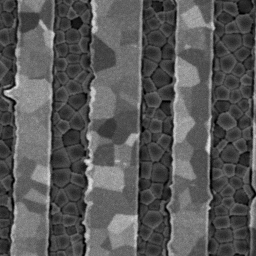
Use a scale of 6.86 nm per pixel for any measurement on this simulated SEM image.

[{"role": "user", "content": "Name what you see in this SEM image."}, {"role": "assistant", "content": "one or a few lines or trenches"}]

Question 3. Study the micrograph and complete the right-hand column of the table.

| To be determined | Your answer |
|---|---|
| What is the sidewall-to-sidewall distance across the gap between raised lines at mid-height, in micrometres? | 0.262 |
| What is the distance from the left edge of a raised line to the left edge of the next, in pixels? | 79.6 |